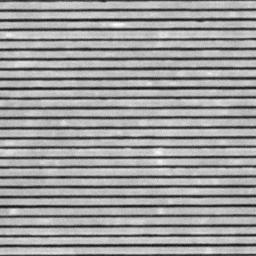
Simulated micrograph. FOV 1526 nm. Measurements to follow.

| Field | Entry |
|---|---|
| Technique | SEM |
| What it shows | parallel lines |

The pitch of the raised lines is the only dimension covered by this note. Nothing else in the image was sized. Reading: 0.0586 microns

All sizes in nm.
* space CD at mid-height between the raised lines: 16.4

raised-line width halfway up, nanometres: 42.5